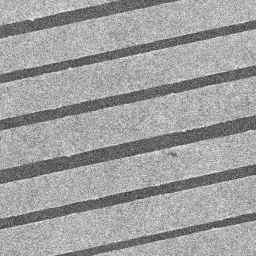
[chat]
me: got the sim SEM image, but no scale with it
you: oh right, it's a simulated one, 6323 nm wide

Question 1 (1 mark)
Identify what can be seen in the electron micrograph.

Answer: parallel lines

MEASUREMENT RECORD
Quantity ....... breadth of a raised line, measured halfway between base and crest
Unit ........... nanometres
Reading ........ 860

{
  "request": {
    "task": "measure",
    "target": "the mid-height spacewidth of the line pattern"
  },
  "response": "275 nm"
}